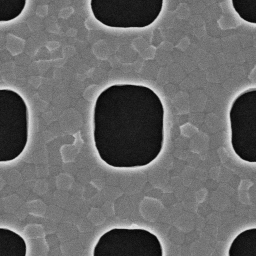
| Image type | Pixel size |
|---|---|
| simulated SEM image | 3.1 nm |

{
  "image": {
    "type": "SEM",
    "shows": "holes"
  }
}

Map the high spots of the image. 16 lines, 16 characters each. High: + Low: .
.+++++....+++++.
+++++++..+++++++
++++++++++++++++
++++++++++++++++
++++++++++++++++
+++++++..+++++++
..++++....+++++.
..++++....++++..
..++++....++++..
.+++++....+++++.
++++++++++++++++
++++++++++++++++
++++++++++++++++
++++++++++++++++
.++++++..++++++.
..++++....++++..